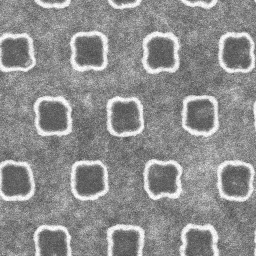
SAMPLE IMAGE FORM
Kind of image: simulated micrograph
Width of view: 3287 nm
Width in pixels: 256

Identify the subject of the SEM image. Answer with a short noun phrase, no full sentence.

a regular array of raised bodies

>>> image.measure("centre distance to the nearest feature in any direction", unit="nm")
927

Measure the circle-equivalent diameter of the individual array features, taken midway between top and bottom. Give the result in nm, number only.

485